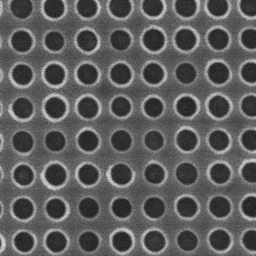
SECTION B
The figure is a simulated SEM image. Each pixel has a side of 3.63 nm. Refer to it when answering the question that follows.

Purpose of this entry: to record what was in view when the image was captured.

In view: a regular array of holes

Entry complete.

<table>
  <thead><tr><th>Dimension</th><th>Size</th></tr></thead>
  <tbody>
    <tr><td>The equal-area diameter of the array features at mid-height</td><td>0.0773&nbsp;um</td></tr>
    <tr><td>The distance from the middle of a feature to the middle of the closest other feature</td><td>118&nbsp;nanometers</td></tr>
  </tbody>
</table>